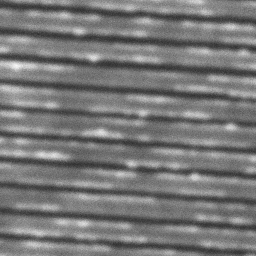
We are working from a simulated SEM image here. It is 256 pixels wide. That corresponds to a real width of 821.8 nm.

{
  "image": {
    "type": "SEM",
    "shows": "parallel lines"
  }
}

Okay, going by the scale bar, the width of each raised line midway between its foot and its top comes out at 55.7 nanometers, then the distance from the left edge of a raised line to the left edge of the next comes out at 82.3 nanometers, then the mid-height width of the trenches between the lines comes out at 26.7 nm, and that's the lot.